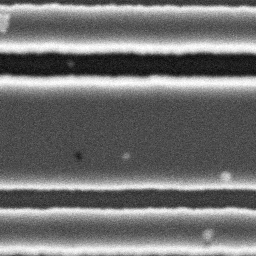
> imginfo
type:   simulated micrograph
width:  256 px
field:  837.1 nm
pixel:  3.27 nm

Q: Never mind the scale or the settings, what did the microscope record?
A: lines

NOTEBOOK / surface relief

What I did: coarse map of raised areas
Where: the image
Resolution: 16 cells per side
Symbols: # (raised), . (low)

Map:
################
################
################
................
................
################
################
################
################
################
################
################
################
################
################
################